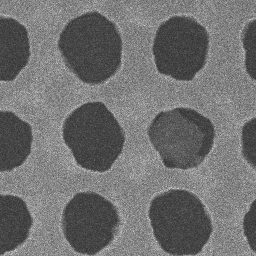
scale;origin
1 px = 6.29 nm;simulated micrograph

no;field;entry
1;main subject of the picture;holes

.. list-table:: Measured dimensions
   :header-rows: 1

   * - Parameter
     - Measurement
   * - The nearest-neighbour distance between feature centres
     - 87.7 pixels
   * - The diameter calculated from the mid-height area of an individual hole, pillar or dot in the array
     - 0.398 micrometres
